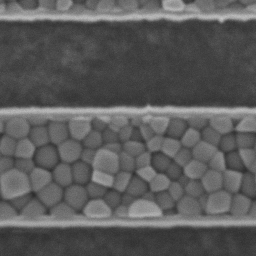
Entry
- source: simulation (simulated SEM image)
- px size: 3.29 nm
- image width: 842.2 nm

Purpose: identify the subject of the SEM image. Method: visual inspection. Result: one or a few lines or trenches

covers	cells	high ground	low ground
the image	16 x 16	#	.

################
................
................
................
................
................
................
################
################
################
################
################
################
################
................
................